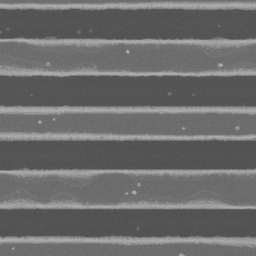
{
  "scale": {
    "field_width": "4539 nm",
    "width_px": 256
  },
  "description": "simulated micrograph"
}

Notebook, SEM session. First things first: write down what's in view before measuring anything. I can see lines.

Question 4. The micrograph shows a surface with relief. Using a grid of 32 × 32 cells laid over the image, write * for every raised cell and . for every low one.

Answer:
********************************
................................
................................
................................
................................
********************************
********************************
********************************
********************************
................................
................................
................................
................................
********************************
********************************
********************************
********************************
................................
................................
................................
................................
********************************
********************************
********************************
********************************
********************************
................................
................................
................................
................................
********************************
********************************